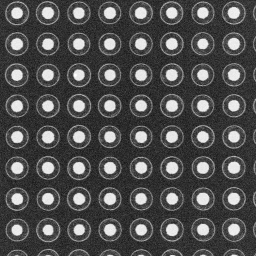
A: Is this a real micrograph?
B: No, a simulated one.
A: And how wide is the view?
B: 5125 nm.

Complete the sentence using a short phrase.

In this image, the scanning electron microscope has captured an array of small figures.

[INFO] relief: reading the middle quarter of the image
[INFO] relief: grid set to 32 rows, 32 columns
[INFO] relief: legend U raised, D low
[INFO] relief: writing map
UUDDDUUUUUDDDUUUUUDDDUUUUDDDDUUU
UDDDDDUUUDDDDDUUUDDDDDUUUDDDDUUU
UDDDDDDUUDDDDDUUDDDDDDUUDDDDDDUU
UDDDDDUUUDDDDDUUUDDDDDUUDDDDDDUU
UDDDDDUUUDDDDUUUUDDDDUUUUDDDDUUU
UUUDUUUUUUUDUUUUUUUUUUUUUUUDUUUU
UUUUUUUUUUUUUUUUUUUUUUUUUUUUUUUU
UUUUUUUUUUUUUUUUUUUUUUUUUUUUUUUU
UUDDDDUUUDDDDUUUUDDDDUUUUDDDDUUU
UDDDDDUUUDDDDDUUUDDDDDUUDDDDDDUU
UDDDDDDUUDDDDDUUDDDDDDUUDDDDDDUU
UDDDDDUUUDDDDDUUUDDDDDUUDDDDDDUU
UUDDDDUUUDDDDUUUUUDDDUUUUDDDDUUU
UUUUUUUUUUUUUUUUUUUUUUUUUUUUUUUU
UUUUUUUUUUUUUUUUUUUUUUUUUUUUUUUU
UUUDDUUUUUUDUUUUUUUDUUUUUUDDUUUU
UUDDDDUUUDDDDDUUUDDDDUUUUDDDDUUU
UDDDDDUUUDDDDDUUUDDDDDUUDDDDDDUU
UDDDDDDUUDDDDDUUUDDDDDUUDDDDDDUU
UDDDDDUUUDDDDDUUUDDDDDUUUDDDDUUU
UUDDDUUUUUDDDUUUUUDDDUUUUUDDDUUU
UUUUUUUUUUUUUUUUUUUUUUUUUUUUUUUU
UUUUUUUUUUUUUUUUUUUUUUUUUUUUUUUU
UUUDDUUUUUUDUUUUUUDDUUUUUUDDUUUU
UDDDDDUUUDDDDDUUUDDDDUUUUDDDDUUU
UDDDDDUUUDDDDDUUUDDDDDUUDDDDDDUU
UDDDDDUUUDDDDDUUUDDDDDUUDDDDDDUU
UDDDDDUUUDDDDDUUUDDDDUUUUDDDDUUU
UUDDDUUUUUDDDUUUUUDDUUUUUUDDUUUU
UUUUUUUUUUUUUUUUUUUUUUUUUUUUUUUU
UUUUUUUUUUUUUUUUUUUUUUUUUUUUUUUU
UUDDDUUUUUDDDUUUUUDDDUUUUDDDDUUU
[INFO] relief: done